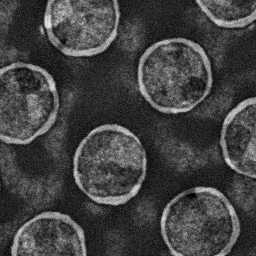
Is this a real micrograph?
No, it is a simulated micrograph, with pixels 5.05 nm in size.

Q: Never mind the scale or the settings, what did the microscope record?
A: raised bodies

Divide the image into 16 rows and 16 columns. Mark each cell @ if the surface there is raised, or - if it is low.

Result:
---@@@@------@@@
---@@@@-------@-
---@@@@---------
---------@@@@---
@@@------@@@@---
@@@------@@@@---
@@@@------@@---@
@@@-----------@@
@@----@@------@@
-----@@@@-----@@
-----@@@@------@
-----@@@@-------
------@@---@@@--
---@------@@@@@-
-@@@@-----@@@@@-
-@@@@------@@@--